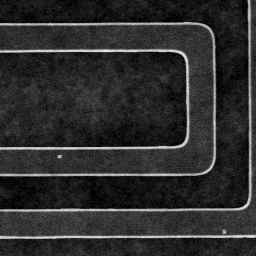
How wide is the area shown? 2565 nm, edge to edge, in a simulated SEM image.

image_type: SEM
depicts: groups of lines, slits or small figures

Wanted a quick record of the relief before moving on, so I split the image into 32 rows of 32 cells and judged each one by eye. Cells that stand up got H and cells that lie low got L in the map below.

LLLLLLLLLLLLLLLLLLLLLLLLLLLLLLLH
LLLLLLLLLLLLLLLLLLLLLLLLLLLLLLLH
LLLLLLLLLLLLLLLLLLLLLLLLLLLLLLLH
HHHHHHHHHHHHHHHHHHHHHHHHHHLLLLLH
HHHHHHHHHHHHHHHHHHHHHHHHHHHLLLLH
HHHHHHHHHHHHHHHHHHHHHHHHHHHLLLLH
LLLLLLLLLLLLLLLLLLLLLLHHHHHLLLLH
LLLLLLLLLLLLLLLLLLLLLLLHHHHLLLLH
LLLLLLLLLLLLLLLLLLLLLLLHHHHLLLLH
LLLLLLLLLLLLLLLLLLLLLLLHHHHLLLLH
LLLLLLLLLLLLLLLLLLLLLLLHHHHLLLLH
LLLLLLLLLLLLLLLLLLLLLLLLHHHLLLLH
LLLLLLLLLLLLLLLLLLLLLLLLHHHLLLLH
LLLLLLLLLLLLLLLLLLLLLLLLHHHLLLLH
LLLLLLLLLLLLLLLLLLLLLLLLHHHLLLLH
LLLLLLLLLLLLLLLLLLLLLLLLHHHLLLLH
LLLLLLLLLLLLLLLLLLLLLLLLHHHLLLLH
LLLLLLLLLLLLLLLLLLLLLLLHHHHLLLLH
LHHHHLLLHHHHHHHHHHHHHHHHHHHLLLLH
HHHHHHHHHHHHHHHHHHHHHHHHHHHLLLLH
HHHHHHHHHHHHHHHHHHHHHHHHHHHLLLLH
HHHHHHHHHHHHHHHHHHHHHHHHHHLLLLLH
LLLLLLLLLLLLLLLLLLLLLLLLLLLLLLLH
LLLLLLLLLLLLLLLLLLLLLLLLLLLLLLLH
LLLLLLLLLLLLLLLLLLLLLLLLLLLLLLLH
LLLLLLLLLLLLLLLLLLLLLLLLLLLLLLLH
HHHHHHHHHHHHHHHHHHHHHHHHHHHHHHHH
HHHHHHHHHHHHHHHHHHHHHHHHHHHHHHHH
HHHHHHHHHHHHHHHHHHHHHHHHHHHHHHHH
HHHHHHHHHHHHHHHHHHHHHHHHLHHHHLLL
LLLLLLLLLLLLLLLLLLLLLLLLLLLLLLLL
LLLLLLLLLLLLLLLLLLLLLLLLLLLLLLLL